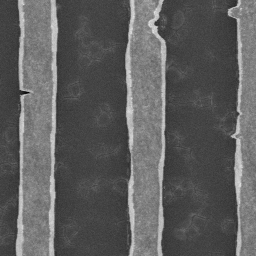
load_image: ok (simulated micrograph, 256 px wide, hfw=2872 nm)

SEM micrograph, one or a few lines or trenches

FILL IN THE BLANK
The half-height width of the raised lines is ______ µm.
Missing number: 0.362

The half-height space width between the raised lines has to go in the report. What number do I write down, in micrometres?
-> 0.864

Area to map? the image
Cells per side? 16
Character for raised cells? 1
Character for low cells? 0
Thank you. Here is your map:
0110000011000001
0110000011000001
0110000011000001
0110000011000001
0110000011000001
0110000011000001
0110000011000001
0110000011000001
0110000011000001
0110000011000001
0110000011000001
0110000011000001
0110000011000001
0110000011000001
0110000011000001
0110000011000001